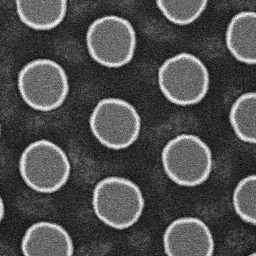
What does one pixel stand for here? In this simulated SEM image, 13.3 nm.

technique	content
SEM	raised bodies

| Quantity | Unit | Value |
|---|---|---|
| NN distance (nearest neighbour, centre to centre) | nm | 1080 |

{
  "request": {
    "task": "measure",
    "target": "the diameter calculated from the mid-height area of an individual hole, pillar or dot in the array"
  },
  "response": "641 nanometers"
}